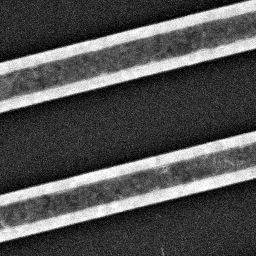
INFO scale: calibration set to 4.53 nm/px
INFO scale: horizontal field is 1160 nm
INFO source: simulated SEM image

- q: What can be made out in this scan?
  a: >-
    one or a few lines or trenches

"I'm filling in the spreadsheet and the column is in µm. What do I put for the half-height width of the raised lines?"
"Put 0.165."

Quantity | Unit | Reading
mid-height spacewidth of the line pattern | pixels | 90.6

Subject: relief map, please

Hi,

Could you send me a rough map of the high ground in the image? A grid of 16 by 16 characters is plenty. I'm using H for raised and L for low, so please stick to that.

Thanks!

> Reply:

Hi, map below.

LLLLLLLLLLLLLLLH
LLLLLLLLLLLHHHHH
LLLLLLLHHHHHHHHH
LLLHHHHHHHHHHLLL
HHHHHHHHHLLLLLLL
HHHHHLLLLLLLLLLL
HLLLLLLLLLLLLLLL
LLLLLLLLLLLLLLLL
LLLLLLLLLLLLLLLL
LLLLLLLLLLLLHHHH
LLLLLLLLHHHHHHHH
LLLLHHHHHHHHHLLL
HHHHHHHHHLLLLLLL
HHHHHLLLLLLLLLLL
HLLLLLLLLLLLLLLL
LLLLLLLLLLLLLLLL